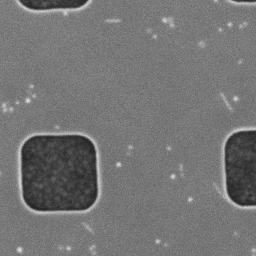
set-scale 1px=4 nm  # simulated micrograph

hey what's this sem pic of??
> holes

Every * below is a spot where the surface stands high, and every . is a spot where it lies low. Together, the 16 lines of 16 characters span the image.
**...***********
****************
****************
****************
****************
****************
****************
****************
**...*********..
*.....********..
*.....********..
*.....********..
**....*********.
****************
****************
****************